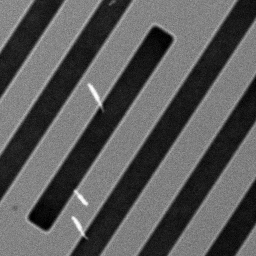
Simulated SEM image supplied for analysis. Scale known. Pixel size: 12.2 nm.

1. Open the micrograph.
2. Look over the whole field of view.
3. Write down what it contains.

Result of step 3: groups of lines, slits or small figures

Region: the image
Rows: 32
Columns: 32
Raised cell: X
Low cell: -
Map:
XXXX----XXXX----XXXXXXXXXXXXX---
XXX----XXXXX----XXXXXXXXXXXXX---
XXX----XXXX----XXXXXXXXXXXXX----
XX----XXXX----XXXXX-XXXXXXX----X
X----XXXXX----XXXX---XXXXXX----X
X----XXXX----XXXXX---XXXXX----XX
----XXXX----XXXXX----XXXX----XXX
---XXXXX----XXXX----XXXXX----XXX
---XXXX----XXXXX----XXXX----XXXX
--XXXX----XXXXX----XXXX----XXXXX
-XXXXX----XXXX----XXXXX----XXXX-
-XXXX----XXXXX----XXXX----XXXXX-
XXXXX---XXXXX----XXXX----XXXXX--
XXXX----XXXX----XXXXX----XXXX---
XXX----XXXXX----XXXX----XXXXX---
XXX---XXXXX----XXXXX---XXXXX----
XX----XXXX----XXXXX----XXXX----X
X----XXXXX----XXXX----XXXXX----X
X----XXXX----XXXX----XXXXX----XX
----XXXX----XXXXX----XXXX----XXX
---XXXXX----XXXX----XXXXX----XXX
--XXXXX----XXXXX----XXXX----XXXX
--XXXX----XXXXX----XXXX----XXXXX
-XXXXX----XXXX----XXXXX----XXXX-
-XXXX----XXXXX---XXXXX----XXXXX-
XXXX----XXXXX----XXXX----XXXXX--
XXXX----XXXX----XXXXX----XXXX---
XXXX---XXXXX---XXXXX----XXXXX---
XXXXX-XXXXX----XXXX----XXXXX----
XXXXXXXXXX----XXXXX----XXXX----X
XXXXXXXXXX----XXXX----XXXXX---XX
XXXXXXXXX----XXXX----XXXXX----XX